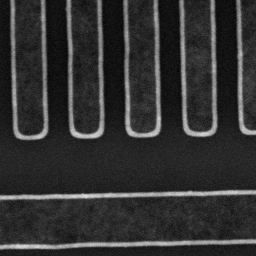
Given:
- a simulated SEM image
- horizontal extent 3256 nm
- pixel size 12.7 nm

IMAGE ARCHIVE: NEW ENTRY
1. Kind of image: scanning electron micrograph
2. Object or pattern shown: groups of lines, slits or small figures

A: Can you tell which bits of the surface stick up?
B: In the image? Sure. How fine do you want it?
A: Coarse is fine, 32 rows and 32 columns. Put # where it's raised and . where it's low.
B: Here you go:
..###....###....###....####...##
..###....###....###....####...##
..###....###....####...####...##
..###....###....####...####...##
..###....####...####...####...##
..####...####...####...####...##
..####...####...####...####...##
..####...####...####...####...##
..####...####...####...####...##
..####...####...####...####...##
..####...####...####...####...##
..####...####...####...####...##
..####...####...####...####...##
..####...####...####...####...##
..####...####...####...####...##
..####...####...####...####...##
..####...###....###.....##......
................................
................................
................................
................................
................................
................................
................................
............####################
################################
################################
################################
################################
################################
#################...............
................................